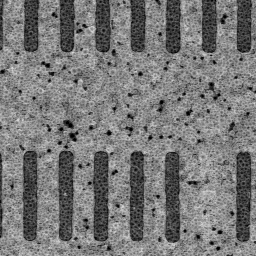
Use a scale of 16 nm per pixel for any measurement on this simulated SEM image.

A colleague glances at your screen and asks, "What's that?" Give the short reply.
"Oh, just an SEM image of holes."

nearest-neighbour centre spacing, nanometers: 1670